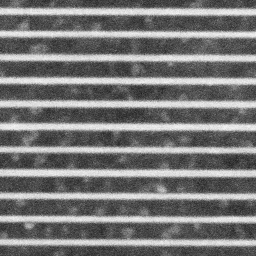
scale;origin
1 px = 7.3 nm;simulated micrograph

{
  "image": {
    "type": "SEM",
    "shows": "parallel lines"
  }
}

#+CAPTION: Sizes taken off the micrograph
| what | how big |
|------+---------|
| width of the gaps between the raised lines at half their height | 0.135 microns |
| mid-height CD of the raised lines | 0.0338 µm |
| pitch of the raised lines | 169 nanometres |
